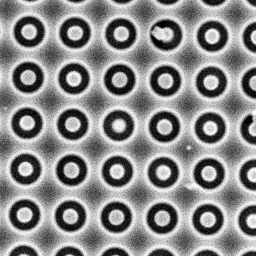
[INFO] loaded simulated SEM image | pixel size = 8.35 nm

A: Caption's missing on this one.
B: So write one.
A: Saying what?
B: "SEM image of an array of small figures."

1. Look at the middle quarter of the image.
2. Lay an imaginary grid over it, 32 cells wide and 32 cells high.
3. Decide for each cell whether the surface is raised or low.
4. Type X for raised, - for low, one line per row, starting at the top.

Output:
-----XXXXXX-----XXXXXXX----XXXXX
------XXXX-------XXXXX-------XXX
-XX----XXX---XX---XXXX-------XXX
-XXX---XXX--XXXX--XXX---XXX---XX
-XXX---XXX--XXX---XXX---XXX---XX
------XXXX---XX---XXX---XXX--XXX
------XXXXX------XXXXX-------XXX
X----XXXXXXX----XXXXXX------XXXX
XXXXXXXXXXXXXXXXXXXXXXXXX-XXXXXX
XXXXXXXXXXXXXXXXXXXXXXXXXXXXXXXX
XXXXXXXXXXXXXXXXXXXXXXXXXXXXXXXX
----XXXXXXXX---XXXXXXXXX--XXXXXX
------XXXXX------XXXXX------XXXX
------XXXX-------XXXXX-------XXX
XXXX---XX---------XXX---XX---XXX
-XXX--XXX----XX---XXX---XXX--XXX
------XXXX--------XXX---XXX--XXX
------XXXX-------XXXX----X---XXX
-----XXXXXX------XXXXX------XXXX
XXXXXXXXXXXXX-XXXXXXXXX----XXXXX
XXXXXXXXXXXXXXXXXXXXXXXXXXXXXXXX
XXXXXXXXXXXXXXXXXXXXXXXXXXXXXXXX
---XXXXXXXXXXXXXXXXXXXXXXXXXXXXX
-----XXXXXX-----XXXXXXX----XXXXX
------XXXX-------XXXXX------XXXX
XXX---XXX--------XXXX--------XXX
XXX---XXX---XX----XXX---XX---XXX
XXX---XXX---XX----XXX---XX---XXX
------XXX--------XXXX--------XXX
-----XXXXX-------XXXX-------XXXX
X---XXXXXXX-----XXXXXX-----XXXXX
XXXXXXXXXXXXXXXXXXXXXXXXXXXXXXXX